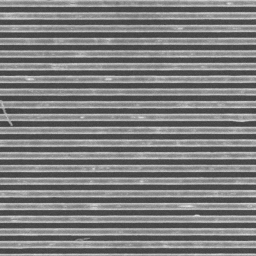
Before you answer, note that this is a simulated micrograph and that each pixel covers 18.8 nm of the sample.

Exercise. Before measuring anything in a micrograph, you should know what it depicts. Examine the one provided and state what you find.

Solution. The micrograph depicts parallel lines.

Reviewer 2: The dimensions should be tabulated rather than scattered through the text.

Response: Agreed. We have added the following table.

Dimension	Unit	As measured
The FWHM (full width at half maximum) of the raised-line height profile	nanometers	117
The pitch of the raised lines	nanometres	238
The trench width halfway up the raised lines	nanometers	117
